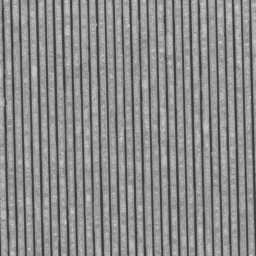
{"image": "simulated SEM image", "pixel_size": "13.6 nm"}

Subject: parallel lines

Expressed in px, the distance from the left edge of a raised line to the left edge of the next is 8.52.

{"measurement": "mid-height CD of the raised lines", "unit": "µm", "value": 0.0835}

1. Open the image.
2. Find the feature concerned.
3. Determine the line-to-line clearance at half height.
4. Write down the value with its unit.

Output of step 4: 35.8 nm